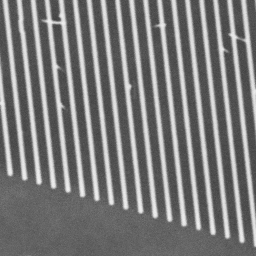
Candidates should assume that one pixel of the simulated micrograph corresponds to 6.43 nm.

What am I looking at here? parallel lines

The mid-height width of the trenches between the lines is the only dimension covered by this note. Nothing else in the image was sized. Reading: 66.3 nanometres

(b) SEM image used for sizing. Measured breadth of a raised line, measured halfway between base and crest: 22.3 nanometres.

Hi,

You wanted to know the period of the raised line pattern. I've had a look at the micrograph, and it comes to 89.5 nanometers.